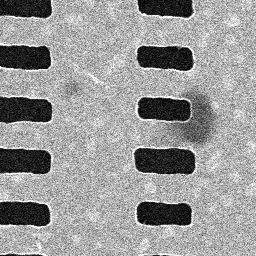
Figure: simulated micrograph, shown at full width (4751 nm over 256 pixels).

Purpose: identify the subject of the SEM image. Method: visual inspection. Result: holes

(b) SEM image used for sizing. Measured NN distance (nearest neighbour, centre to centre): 0.959 micrometres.